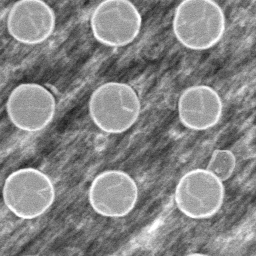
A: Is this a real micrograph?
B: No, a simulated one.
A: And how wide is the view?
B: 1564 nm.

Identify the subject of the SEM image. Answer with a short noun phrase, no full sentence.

raised bodies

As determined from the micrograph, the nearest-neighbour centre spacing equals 518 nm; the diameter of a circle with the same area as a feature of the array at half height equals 47.8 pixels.